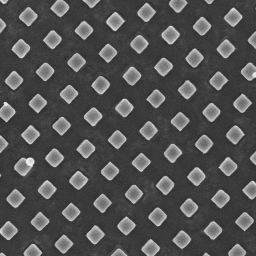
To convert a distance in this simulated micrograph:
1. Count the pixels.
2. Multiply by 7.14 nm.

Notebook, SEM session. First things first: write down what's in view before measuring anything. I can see a regular array of raised bodies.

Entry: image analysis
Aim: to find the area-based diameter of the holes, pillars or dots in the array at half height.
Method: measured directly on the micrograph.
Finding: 114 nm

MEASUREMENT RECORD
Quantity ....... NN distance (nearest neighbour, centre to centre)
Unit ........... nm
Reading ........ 232